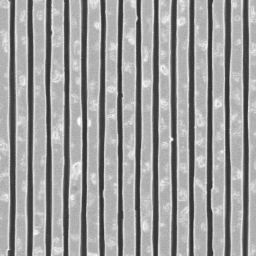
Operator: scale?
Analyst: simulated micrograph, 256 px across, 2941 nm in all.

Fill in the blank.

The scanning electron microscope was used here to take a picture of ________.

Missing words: parallel lines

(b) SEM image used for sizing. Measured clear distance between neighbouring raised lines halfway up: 0.0603 µm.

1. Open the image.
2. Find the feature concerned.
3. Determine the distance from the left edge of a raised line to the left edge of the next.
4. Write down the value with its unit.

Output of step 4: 206 nanometers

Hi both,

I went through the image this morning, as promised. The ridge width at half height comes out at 149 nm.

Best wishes